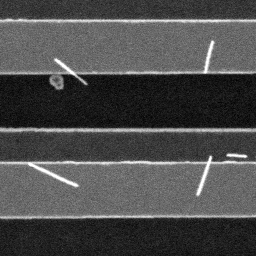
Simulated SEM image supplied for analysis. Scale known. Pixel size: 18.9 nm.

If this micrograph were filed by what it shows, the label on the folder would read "lines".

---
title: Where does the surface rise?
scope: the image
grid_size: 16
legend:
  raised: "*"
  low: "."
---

****************
****************
****************
****************
****************
................
................
................
****************
****************
****************
****************
****************
**********......
................
................